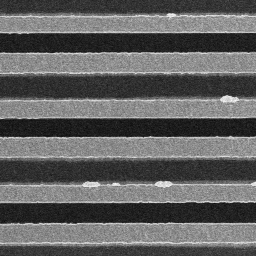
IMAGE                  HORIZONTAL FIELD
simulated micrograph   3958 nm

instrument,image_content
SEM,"lines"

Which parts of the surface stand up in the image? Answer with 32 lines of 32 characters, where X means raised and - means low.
--------------------------------
--------------------------------
XXXXXXXXXXXXXXXXXXXXXXXXXXXXXXXX
XXXXXXXXXXXXXXXXXXXXXXXXXXXXXXXX
--------------------------------
--------------------------------
--------------------------------
XXXXXXXXXXXXXXXXXXXXXXXXXXXXXXXX
XXXXXXXXXXXXXXXXXXXXXXXXXXXXXXXX
--------------------------------
--------------------------------
--------------------------------
------------------------X--XXX--
XXXXXXXXXXXXXXXXXXXXXXXXXXXXXXXX
XXXXXXXXXXXXXXXXXXXXXXXXXXXXXXXX
--------------------------------
--------------------------------
XXXXXXXXXXXXXXXXXXXXXXXXXXXXXXXX
XXXXXXXXXXXXXXXXXXXXXXXXXXXXXXXX
XXXXXXXXXXXXXXXXXXXXXXXXXXXXXXXX
--------------------------------
--------------------------------
--------------------------------
XXXXXXXXXXXXXXXXXXXXXXXXXXXXXXXX
XXXXXXXXXXXXXXXXXXXXXXXXXXXXXXXX
--------------------------------
--------------------------------
--------------------------------
XXXXXXXXXXXXXXXXXXXXXXXXXXXXXXXX
XXXXXXXXXXXXXXXXXXXXXXXXXXXXXXXX
---X-----X----------------------
--------------------------------